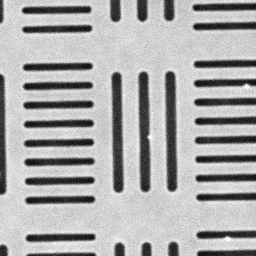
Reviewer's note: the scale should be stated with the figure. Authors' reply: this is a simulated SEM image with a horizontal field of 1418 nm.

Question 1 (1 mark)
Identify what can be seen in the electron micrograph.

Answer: groups of lines, slits or small figures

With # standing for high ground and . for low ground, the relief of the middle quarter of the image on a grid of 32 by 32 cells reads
.......#########################
......##########################
############..#####..####...####
############..####...####...####
.......#####...###...####...####
.......#####...###...####...####
############...###...####...####
############...###...####...####
############...###...####...####
.......#####...###...####...####
.......#####...###...####...####
############...###...####...####
############...###....###...####
############...####...###...####
........####...####...###...####
.......#####...####...###...####
############...####...###...####
############...####...###...####
############...####..####...####
........####...####...###...####
.......#####...####...###...####
############...####...###...####
############...####...###...####
.......#####...####...###...####
........####...####...###...####
.......#####...####...###...####
############...####...####..####
############...####...####..####
........####...####...####..####
........####...####...####..####
############...####...####..####
############...####..#####..####